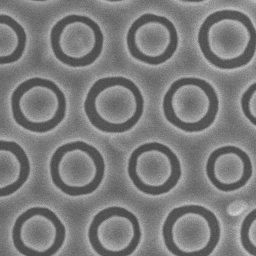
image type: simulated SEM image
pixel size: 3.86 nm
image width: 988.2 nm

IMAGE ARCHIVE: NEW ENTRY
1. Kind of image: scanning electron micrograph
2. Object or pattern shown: ring-shaped grooves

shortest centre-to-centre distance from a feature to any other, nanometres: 284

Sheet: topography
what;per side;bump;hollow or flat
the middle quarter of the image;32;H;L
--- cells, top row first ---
HLLLLLHHHHHHHHHHHHHHHHHHHHHHHHHH
HHHHHHHHHHHHHHHHHHHHHHHHHHHHHHHH
HHHHHHHHHHHHHHHHHHHHHHHHHHHHHHHH
HHHHHHHHHHLLLLLLHHHHHHHHHHHHHHLL
HHHHHHHHLLLLLLLLLHHHHHHHHHHHLLLL
HHHHHHHLLLLLHHHLLLHHHHHHHHHLLLHH
HHHHHHLLLLHHHHHHLLLHHHHHHHLLHHHH
HHHHHHLLLHHHHHHHHLLHHHHHHLLLHHHH
HHHHHLLLHHHHHHHHHHLLHHHHHLLHHHHH
LHHHHLLLHHHHHHHHHHLLHHHHHLLHHHHH
LHHHHLLLHHHHHHHHHHLLHHHHLLLHHHHH
LHHHHLLLHHHHHHHHHHLLHHHHHLLHHHHH
LHHHHLLLLHHHHHHHHLLLHHHHHLLLHHHH
HHHHHHLLLLHHHHHHLLLHHHHHHLLLLHHH
HHHHHHHLLLLHHHHLLLHHHHHHHHLLLLLH
HHHHHHHLLLLLLLLLLLHHHHHHHHHHLLLL
HHHHHHHHLLLLLLLLHHHHHHHHHHHHHLLL
HHHHHHHHHHHHHHHHHHHHHHHHHHHHHHHH
HHHHHHHHHHHHHHHHHHHHHHHHHHHHHHHH
HHLLLHHHHHHHHHHHHHHHHHLHHHHHHHHH
LLLLLLLHHHHHHHHHHHHLLLLLLLHHHHHH
LLLHLLLLHHHHHHHHHLLLLLLLLLLHHHHH
LHHHHLLLLHHHHHHHHLLHHHHHHLLLHHHH
HHHHHHHLLLHHHHHHLLLHHHHHHHLLHHHH
HHHHHHHLLLHHHHHHLLHHHHHHHHLLLHHH
HHHHHHHHLLHHHHHHLLHHHHHHHHHLLHHH
HHHHHHHHLLHHHHHHLLHHHHHHHHHLLHHH
HHHHHHHHLLHHHHHHLLHHHHHHHHHLLHHH
HHHHHHHLLLHHHHHHHLLHHHHHHHLLLHHH
HHHHHHHLLHHHHHHHHLLLHHHHHLLLHHHH
LLLHHLLLLHHHHHHHHHLLLLLLLLLLHHHH
LLLLLLLLHHHHHHHHHHHLLLLLLLLHHHHH